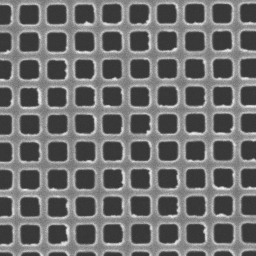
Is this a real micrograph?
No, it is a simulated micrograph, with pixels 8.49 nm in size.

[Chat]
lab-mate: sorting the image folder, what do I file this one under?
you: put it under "a regular array of holes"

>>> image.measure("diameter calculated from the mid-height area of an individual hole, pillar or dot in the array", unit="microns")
0.177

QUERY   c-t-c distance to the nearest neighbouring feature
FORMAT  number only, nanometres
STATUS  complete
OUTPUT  230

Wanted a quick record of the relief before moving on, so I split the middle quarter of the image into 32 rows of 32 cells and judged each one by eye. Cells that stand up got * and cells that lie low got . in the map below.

.**.....**.....*.....**.....**..
***.....**.....*.....**.....**..
.**....***....***....**.....**..
****...****.*.****...***....***.
********************************
********************************
***....***....***....***....**..
.**.....**....**.....**.....**..
.**.....**.....*.....**.....**..
.**....***....**.....**.....**..
************.****...******.****.
********************************
****..*****..*****..*****..****.
.**....***....***....***....**..
.**.....**.....*.....**.....**..
.**.....**....**.....**.....**..
.**....***....***....***....**..
********************************
********************************
****...***....***....***....***.
.**.....**....**.....**.....**..
.**.....**.....*.....**.....**..
.**.....**.....**.....**.....*..
.**.....**.....**....***....***.
********************************
********************************
***....***....***....***....***.
.**.....**.....**....***....***.
.**.....**.....**.....**....**..
.**.....**.....**.....**.....*..
.**.....**.....**....***....***.
********************************